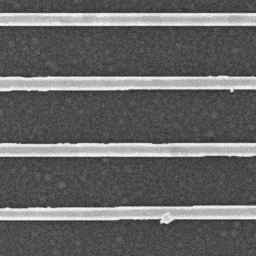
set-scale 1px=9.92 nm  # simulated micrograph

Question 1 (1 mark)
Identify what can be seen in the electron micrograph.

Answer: lines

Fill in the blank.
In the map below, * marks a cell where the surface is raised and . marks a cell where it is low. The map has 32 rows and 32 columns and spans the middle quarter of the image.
................................
................................
................................
*........***********************
********************************
********************************
................................
................................
................................
................................
................................
................................
................................
................................
................................
................................
................................
................................
................................
................................
********************************
********************************
********************************
................................
................................
................................
................................
................................
................................
................................
................................
................................